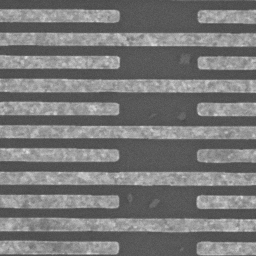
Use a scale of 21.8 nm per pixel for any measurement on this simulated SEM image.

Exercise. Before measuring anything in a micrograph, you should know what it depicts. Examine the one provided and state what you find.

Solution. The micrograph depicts wiring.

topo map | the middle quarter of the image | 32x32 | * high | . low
**************..................
................................
................................
................................
********************************
********************************
********************************
................................
................................
................................
**************..................
**************..................
*************...................
.............................*..
................................
................................
********************************
********************************
.....................***********
................................
................................
*************...................
**************..................
**************..................
................................
................................
................................
********************************
********************************
********************************
................................
................................